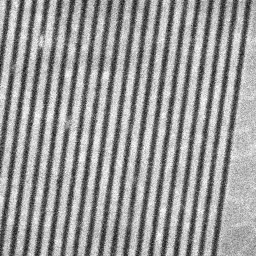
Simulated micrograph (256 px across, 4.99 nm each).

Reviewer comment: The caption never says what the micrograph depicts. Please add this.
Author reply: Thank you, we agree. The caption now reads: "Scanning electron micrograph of parallel lines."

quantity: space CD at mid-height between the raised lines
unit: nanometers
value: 30.9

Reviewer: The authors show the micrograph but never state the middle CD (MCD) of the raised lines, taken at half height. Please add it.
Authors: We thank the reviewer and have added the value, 30.9 nm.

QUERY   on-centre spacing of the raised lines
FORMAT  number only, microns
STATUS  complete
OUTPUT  0.0623